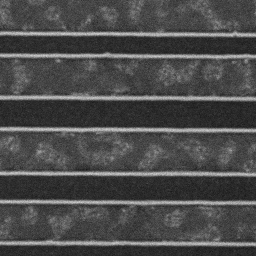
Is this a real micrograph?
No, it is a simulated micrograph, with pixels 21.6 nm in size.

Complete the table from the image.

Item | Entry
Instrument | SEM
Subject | one or a few lines or trenches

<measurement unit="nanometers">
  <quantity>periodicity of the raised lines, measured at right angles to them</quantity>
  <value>1540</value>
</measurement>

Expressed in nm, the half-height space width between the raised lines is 904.